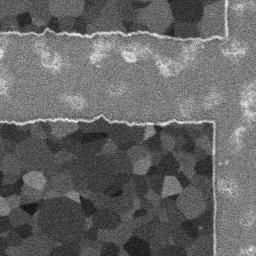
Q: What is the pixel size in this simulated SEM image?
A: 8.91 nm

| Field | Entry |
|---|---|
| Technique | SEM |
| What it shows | one or a few lines or trenches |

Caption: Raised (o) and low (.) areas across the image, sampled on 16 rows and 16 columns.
oooooooooooooo..
oooooooooooooo..
................
................
................
................
................
..oo..o.........
ooooooooooooo...
ooooooooooooo...
ooooooooooooo...
ooooooooooooo...
ooooooooooooo...
ooooooooooooo...
ooooooooooooo...
ooooooooooooo...